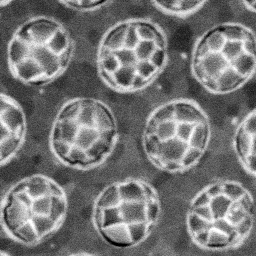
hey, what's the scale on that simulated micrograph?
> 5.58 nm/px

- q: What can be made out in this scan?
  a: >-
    holes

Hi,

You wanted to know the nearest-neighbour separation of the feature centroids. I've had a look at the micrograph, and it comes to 507 nm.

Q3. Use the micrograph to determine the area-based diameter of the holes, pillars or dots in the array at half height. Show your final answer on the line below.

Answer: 356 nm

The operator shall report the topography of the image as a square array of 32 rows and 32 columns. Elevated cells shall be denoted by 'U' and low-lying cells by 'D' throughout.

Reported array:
UUUUUUUUUDDDUUUUUUUUDDDDDUUUUUUD
UUUUUUUUUUUUUUUUUUUUUUUUUUUUUUUU
UUUUUDUUUUUUUUUUUUUUUUUUUUUUUUUU
UUUDDDDDUUUUUUUDDDDUUUUUUUUDDDUU
UUDDDDDDDUUUUDDDDDDDUUUUUUDDDDDD
UDDDDDDDDUUUUDDDDDDDUUUUUDUDDDDD
UDDDDDDDDUUUUDDDDDDDUUUUDDDDDDDD
UDDDDDDDDUUUDDDDDDDDUUUUDDDDDDDD
UDDDDDDDUUUUUDDDDDDDUUUUDDDDDDDD
UUDDDDDUUUUUUDDDDDDUUUUUDDDDDDDU
UUUUDUUUUUUUUUDDDDUUUUUUUDDDDDUU
UUUUUUUUUUUUUUUUUUUUUUUUUUUDUUUU
DDUUUUUUUDDDUUUUUUUUUUUUUUUUUUUU
DDUUUUUUDDDDDUUUUUUUDDDDDUUUUUUU
DDDUUUUDDDDDDDUUUUUDDDDDDDUUUUUD
DDDUUUUDDDDDDDUUUUDDDDDDDDUUUUDD
DDDUUUUDDDDDDDUUUUDDDDDDDDUUUUDD
DDUUUUDDDDDDDDUUUUDDDDDDDDUUUUDD
DDUUUUUDDDDDDDUUUUDDDDDDDDUUUUDD
DUUUUUUDDDDDDUUUUUUDDDDDDUUUUUDD
UUUUUUUUUUDUUUUUUUUUDDDDUUUUUUUD
UUUUUUUUUUUUUUUUUUUUUUUUUUUUUUUU
UUUDDDUUUUUUUUUUUUUUUUUUUUUUUUUU
UUDDDDDUUUUUUUDDDDDUUUUUUUDDDDUU
UDDDDDDDUUUUUDDDDDDUUUUUUDDDDDDU
UDDDDDDDUUUUDDDDDDDDUUUUDDDDDDDU
UDDDDDDDUUUUDDDDDDDDUUUUDDDDDDDD
UDDDDDDDUUUUDDDDDDDUUUUDDDDDDDDD
UDDDDDDUUUUUDDDDDDDUUUUUDDDDDDDU
UUDDDDUUUUUUUDUUDDUUUUUUDDDDDDUU
UUUUUUUUUUUUUUDUDUUUUUUUUDDDDUUU
UUUUUUUUUUUUUUUUUUUUUUUUUUUUUUUU